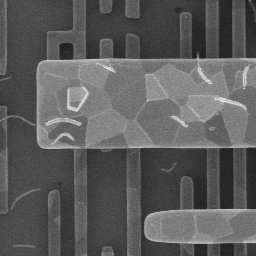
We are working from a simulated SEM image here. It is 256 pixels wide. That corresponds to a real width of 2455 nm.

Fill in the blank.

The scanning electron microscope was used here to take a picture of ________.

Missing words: wiring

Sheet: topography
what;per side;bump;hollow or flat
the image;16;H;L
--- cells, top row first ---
LLLLLLLLLLLLLLLL
LLLLLLLLLLLLLLLL
LLLLLLLLLLLLLLLL
LLLLLLLLLLLLLLLL
LLHHHHHHHHHHHHHH
LLHHHHHHHHHHHHHH
LLHHHHHHHHHHHHHH
LLHHHHHHHHHHHHHH
LLHHHHHHHHHHHHHH
LLLLLLLLLLLLLLLL
LLLLLLLLLLLLLLLL
LLLLLLLLLLLLLLLL
LLLLLLLLLLLLLLLL
LLLLLLLLLHHHHHHH
LLLLLLLLLHHHHHHH
LLLLLLLLLLLLLLLL